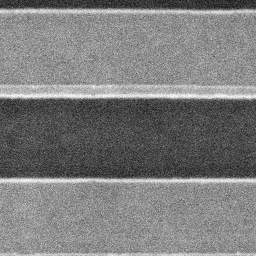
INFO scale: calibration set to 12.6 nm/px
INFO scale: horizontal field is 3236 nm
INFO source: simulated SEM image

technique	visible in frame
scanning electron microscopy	lines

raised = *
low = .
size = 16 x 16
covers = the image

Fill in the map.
................
****************
****************
****************
****************
****************
................
................
................
................
................
****************
****************
****************
****************
****************